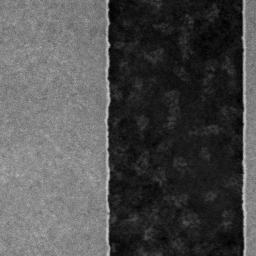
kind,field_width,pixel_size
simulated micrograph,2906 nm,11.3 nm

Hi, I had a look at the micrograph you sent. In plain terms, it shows one or a few lines or trenches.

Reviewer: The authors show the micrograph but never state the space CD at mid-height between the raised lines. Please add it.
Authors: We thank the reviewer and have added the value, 1560 nm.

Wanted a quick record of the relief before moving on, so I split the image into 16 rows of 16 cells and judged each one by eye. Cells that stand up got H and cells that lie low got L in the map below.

HHHHHHHLLLLLLLLH
HHHHHHHLLLLLLLLH
HHHHHHHLLLLLLLLH
HHHHHHHLLLLLLLLH
HHHHHHHLLLLLLLLH
HHHHHHHLLLLLLLLH
HHHHHHHLLLLLLLLH
HHHHHHHLLLLLLLLH
HHHHHHHLLLLLLLLH
HHHHHHHLLLLLLLLH
HHHHHHHLLLLLLLLH
HHHHHHHLLLLLLLLH
HHHHHHHLLLLLLLLH
HHHHHHHLLLLLLLLH
HHHHHHHLLLLLLLLH
HHHHHHHLLLLLLLLH